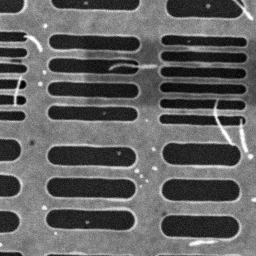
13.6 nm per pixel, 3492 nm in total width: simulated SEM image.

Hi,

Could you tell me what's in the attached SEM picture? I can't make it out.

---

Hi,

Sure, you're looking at groups of lines, slits or small figures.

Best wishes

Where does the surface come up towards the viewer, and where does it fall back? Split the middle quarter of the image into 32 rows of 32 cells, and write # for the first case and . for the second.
..................#######....###
...................#####........
########.........#######........
################################
....######################.#####
..................######........
...................#####........
...................############.
##########.......###############
########################........
........##...###########........
..................##############
...................#############
..................######........
######..#####....#######........
################################
################################
################################
################################
################################
.......##################.......
.................########.......
..................######........
..................#######.......
..................########......
.................###############
################################
################################
.....###.#######################
.................########.......
..................######........
..................######........